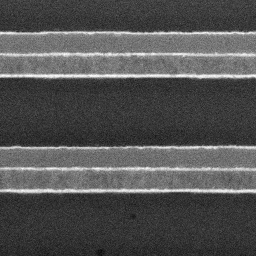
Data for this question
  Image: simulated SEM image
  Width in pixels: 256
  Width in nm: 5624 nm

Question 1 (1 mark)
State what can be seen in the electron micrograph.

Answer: lines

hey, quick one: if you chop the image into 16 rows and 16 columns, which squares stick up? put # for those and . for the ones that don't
................
................
################
################
################
................
................
................
................
################
################
################
................
................
................
................